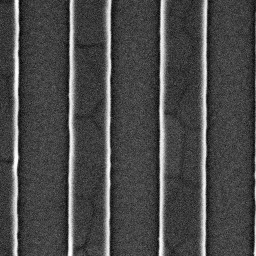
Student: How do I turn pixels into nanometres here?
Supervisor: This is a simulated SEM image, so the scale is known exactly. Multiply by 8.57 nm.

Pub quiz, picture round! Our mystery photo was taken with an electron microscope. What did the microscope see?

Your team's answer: wiring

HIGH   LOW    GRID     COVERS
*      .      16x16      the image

*...***...***...
*...***...***...
*...***...***...
*...***...***...
*...***...***...
*...***...***...
*...***...***...
*...***...***...
*...***...***...
*...***...***...
*...***...***...
*...***...***...
*...***...***...
*...***...***...
*...***...***...
*...***...***...